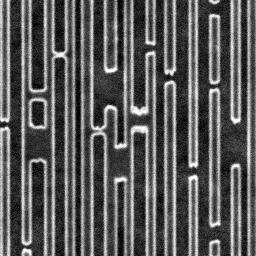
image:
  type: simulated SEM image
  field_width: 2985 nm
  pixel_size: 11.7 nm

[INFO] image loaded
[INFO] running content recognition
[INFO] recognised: parallel lines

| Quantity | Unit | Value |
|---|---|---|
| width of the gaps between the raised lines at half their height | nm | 147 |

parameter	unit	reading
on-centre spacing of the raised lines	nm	245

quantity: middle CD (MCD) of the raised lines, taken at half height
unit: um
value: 0.0991